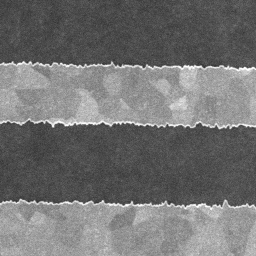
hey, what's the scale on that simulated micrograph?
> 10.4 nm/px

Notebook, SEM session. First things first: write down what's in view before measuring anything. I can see one or a few lines or trenches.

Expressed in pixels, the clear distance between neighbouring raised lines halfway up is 80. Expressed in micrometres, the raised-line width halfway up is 0.606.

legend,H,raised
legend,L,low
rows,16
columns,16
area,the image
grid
LLLLLLLLLLLLLLLL
LLLLLLLLLLLLLLLL
LLLLLLLLLLLLLLLL
LLLLLLLLLLLLLLLL
HHHHHHHHHHHHHHHH
HHHHHHHHHHHHHHHH
HHHHHHHHHHHHHHHH
HHHHHHHHHHHHHHHH
LLLLLLLLLLLLLLLL
LLLLLLLLLLLLLLLL
LLLLLLLLLLLLLLLL
LLLLLLLLLLLLLLLL
LLLLLLLLLLLLLLLL
HHHHHHHHHHHHHHHH
HHHHHHHHHHHHHHHH
HHHHHHHHHHHHHHHH